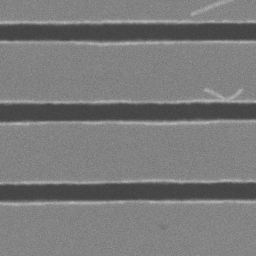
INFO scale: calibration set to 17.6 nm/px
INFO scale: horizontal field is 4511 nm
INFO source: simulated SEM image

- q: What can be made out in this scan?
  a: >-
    lines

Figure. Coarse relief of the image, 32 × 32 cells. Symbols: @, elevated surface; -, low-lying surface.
@@@@@@@@@@@@@@@@@@@@@@@@@@@@@@@@
@@@@@@@@@@@@@@@@@@@@@@@@@@@@@@@@
@@@@@@@@@@@@@@@@@@@@@@@@@@@@@@@@
--------------------------------
--------------------------------
@@@@@@@@@@@@@@@@@@@@@@@@@@@@@@@@
@@@@@@@@@@@@@@@@@@@@@@@@@@@@@@@@
@@@@@@@@@@@@@@@@@@@@@@@@@@@@@@@@
@@@@@@@@@@@@@@@@@@@@@@@@@@@@@@@@
@@@@@@@@@@@@@@@@@@@@@@@@@@@@@@@@
@@@@@@@@@@@@@@@@@@@@@@@@@@@@@@@@
@@@@@@@@@@@@@@@@@@@@@@@@@@@@@@@@
@@@@@@@@@@@@@@@@@@@@@@@@@@@@@@@@
--------------------------------
--------------------------------
@@@@@@@@@@@@@@@@@@@@@@@@@@@@@@@@
@@@@@@@@@@@@@@@@@@@@@@@@@@@@@@@@
@@@@@@@@@@@@@@@@@@@@@@@@@@@@@@@@
@@@@@@@@@@@@@@@@@@@@@@@@@@@@@@@@
@@@@@@@@@@@@@@@@@@@@@@@@@@@@@@@@
@@@@@@@@@@@@@@@@@@@@@@@@@@@@@@@@
@@@@@@@@@@@@@@@@@@@@@@@@@@@@@@@@
@@@@@@@@@@@@@@@@@@@@@@@@@@@@@@@@
--------------------------------
--------------------------------
@@@@@@@@@@@@@@@@@@@@@@@@@@@@@@@@
@@@@@@@@@@@@@@@@@@@@@@@@@@@@@@@@
@@@@@@@@@@@@@@@@@@@@@@@@@@@@@@@@
@@@@@@@@@@@@@@@@@@@@@@@@@@@@@@@@
@@@@@@@@@@@@@@@@@@@@@@@@@@@@@@@@
@@@@@@@@@@@@@@@@@@@@@@@@@@@@@@@@
@@@@@@@@@@@@@@@@@@@@@@@@@@@@@@@@